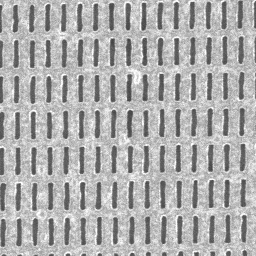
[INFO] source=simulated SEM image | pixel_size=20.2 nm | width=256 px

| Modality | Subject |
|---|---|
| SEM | a regular array of holes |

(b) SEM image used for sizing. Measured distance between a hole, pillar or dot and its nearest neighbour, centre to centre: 321 nm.